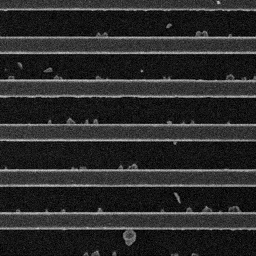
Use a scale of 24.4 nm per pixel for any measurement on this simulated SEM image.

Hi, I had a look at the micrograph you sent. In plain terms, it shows lines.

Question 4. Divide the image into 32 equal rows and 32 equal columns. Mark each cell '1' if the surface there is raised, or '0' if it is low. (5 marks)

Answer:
11111111111111111111111111111111
00000000000000000000000000000000
00000000000000000000000000000000
00000000000000000000000000000000
00000000000000000000000000000000
11111111111111111111111111111111
11111111111111111111111111111111
00000000000000000000000000000000
00000000000000000000000000000000
00000000000000000000000000000000
11111111111111111111111111111111
11111111111111111111111111111111
00000000000000000000000000000000
00000000000000000000000000000000
00000000000000000000000000000000
00000000000000000000000000000000
11111111111111111111111111111111
11111111111111111111111111111111
00000000000000000000000000000000
00000000000000000000000000000000
00000000000000000000000000000000
11111111111111111111111111111111
11111111111111111111111111111111
00000000000000000000000000000000
00000000000000000000000000000000
00000000000000000000000000000000
00000000000000000000000000000000
11111111111111111111111111111111
11111111111111111111111111111111
00000000000000000000000000000000
00000000000000000000000000000000
00000000000000000000000000000000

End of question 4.